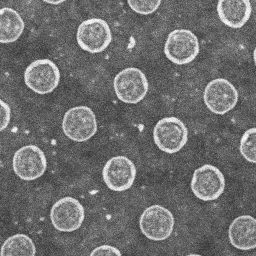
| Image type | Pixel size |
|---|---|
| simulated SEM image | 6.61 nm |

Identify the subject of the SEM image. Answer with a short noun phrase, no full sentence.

a regular array of raised bodies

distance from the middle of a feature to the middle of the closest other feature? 411 nm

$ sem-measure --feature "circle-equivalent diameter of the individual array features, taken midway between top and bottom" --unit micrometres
0.218